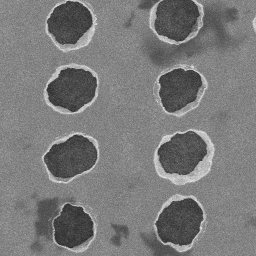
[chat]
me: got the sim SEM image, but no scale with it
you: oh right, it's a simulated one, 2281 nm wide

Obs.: holes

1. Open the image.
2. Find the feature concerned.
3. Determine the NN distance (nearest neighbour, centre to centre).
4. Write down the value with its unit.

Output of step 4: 578 nanometers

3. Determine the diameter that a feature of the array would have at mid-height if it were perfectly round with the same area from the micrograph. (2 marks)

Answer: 414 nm